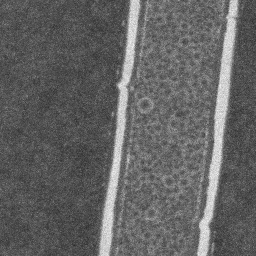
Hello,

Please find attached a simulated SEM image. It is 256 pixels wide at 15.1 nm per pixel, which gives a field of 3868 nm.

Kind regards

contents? one or a few lines or trenches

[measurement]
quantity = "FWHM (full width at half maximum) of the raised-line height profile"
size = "1.46 µm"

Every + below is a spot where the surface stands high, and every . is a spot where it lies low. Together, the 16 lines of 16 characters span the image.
........+++++++.
........++++++..
........++++++..
........++++++..
........++++++..
........++++++..
........++++++..
........++++++..
.......+++++++..
.......+++++++..
.......++++++...
.......++++++...
.......++++++...
.......++++++...
.......++++++...
.......++++++...